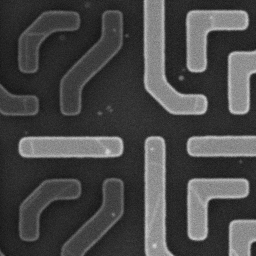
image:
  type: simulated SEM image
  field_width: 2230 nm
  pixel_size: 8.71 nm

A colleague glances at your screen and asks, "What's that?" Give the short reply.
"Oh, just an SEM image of wiring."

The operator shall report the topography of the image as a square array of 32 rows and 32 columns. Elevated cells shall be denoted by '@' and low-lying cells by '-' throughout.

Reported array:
------------------@@------------
------@@@----@@---@@----@@@@@@@-
-----@@@@@---@@---@@---@@@@@@@@-
----@@@@@@---@@---@@@--@@@@@@@@-
---@@@-------@@---@@@--@@@------
--@@@-------@@@---@@@--@@@------
--@@@------@@@@---@@@--@@@-----@
--@@@-----@@@@----@@@--@@@---@@@
---@@----@@@@-----@@@---@@---@@@
--------@@@@------@@@--------@@-
--------@@@-------@@@--------@@-
@-------@@---------@@@-------@@-
@@@@@---@@----------@@@@@@---@@-
@@@@@---@@-----------@@@@@---@@-
--------------------------------
--------------------------------
--------------------------------
---@@@@@@@@@@@@---@@----@@@@@@@@
---@@@@@@@@@@@@---@@@---@@@@@@@@
---@@@@@@@@@@@----@@@-----------
------------------@@@-----------
------------------@@@-----------
-------------@@---@@@---@@@@@@@-
-----@@@@@---@@---@@@---@@@@@@@-
----@@@@@@---@@---@@@---@@@@@@@-
---@@@-------@@---@@@---@@------
---@@-------@@@---@@@---@@------
---@@------@@@@---@@@---@@------
---@@-----@@@@----@@@---@@---@@@
---@@----@@@@-----@@@---@@---@@@
--------@@@@------@@@--------@@-
--------@@@-------@@@--------@@-